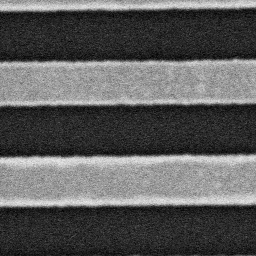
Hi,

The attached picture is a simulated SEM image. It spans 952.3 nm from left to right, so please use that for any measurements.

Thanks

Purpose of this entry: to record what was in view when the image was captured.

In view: lines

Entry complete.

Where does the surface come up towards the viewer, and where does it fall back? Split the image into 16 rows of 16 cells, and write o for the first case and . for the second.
ooooooooooo.....
................
................
................
oooooooooooooooo
oooooooooooooooo
ooooo.o.........
................
................
................
oooooooooooooooo
oooooooooooooooo
oooooooooooooooo
................
................
................